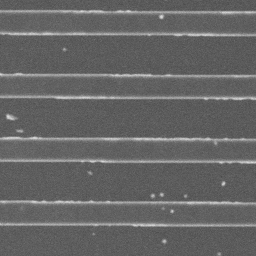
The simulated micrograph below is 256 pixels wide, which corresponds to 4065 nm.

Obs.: lines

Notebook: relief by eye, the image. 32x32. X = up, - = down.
--------------------------------
XXXXXXXXXXXXX-XXX---------------
XXXXXXXXXXXXXXXXXXXXXXXXXXXXXXXX
XXXXXXXXXXXXXXXXXXXXXXXXXXXXXXXX
--------------------------------
--------------------------------
--------------------------------
--------------------------------
--------------------------------
XXXXXXXXXXXXXXXXXXXXXXXXXXXXXXXX
XXXXXXXXXXXXXXXXXXXXXXXXXXXXXXXX
XXXXXXXXXXXXXXXXXXXXXXXXXXXXXXXX
--------------------------------
--------------------------------
--------------------------------
--------------------------------
--------------------------------
XXXXXXXXXXXXXXXXXXXXXXXXXXXXXXXX
XXXXXXXXXXXXXXXXXXXXXXXXXXXXXXXX
XXXXXXXXXXXXXXXXXXXXXXXXXXXXXXXX
--------------------------------
--------------------------------
--------------------------------
--------------------------------
--------------------------------
XXXXXXXXXXXXXXXXXXXXXXXXXXXXXXXX
XXXXXXXXXXXXXXXXXXXXXXXXXXXXXXXX
XXXXXXXXXXXXXXXXXXXXXXXXXXXXXXXX
--------------------------------
--------------------------------
--------------------------------
--------------------------------